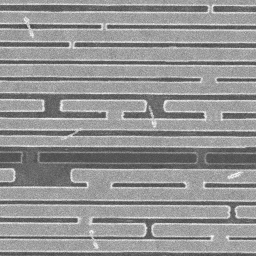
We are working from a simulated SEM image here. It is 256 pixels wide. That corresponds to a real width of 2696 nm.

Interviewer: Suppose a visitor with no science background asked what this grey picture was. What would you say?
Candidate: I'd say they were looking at parallel lines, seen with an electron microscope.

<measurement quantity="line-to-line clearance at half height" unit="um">0.0618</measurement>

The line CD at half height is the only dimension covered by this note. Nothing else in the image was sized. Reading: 126 nm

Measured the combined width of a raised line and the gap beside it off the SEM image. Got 184 nanometres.